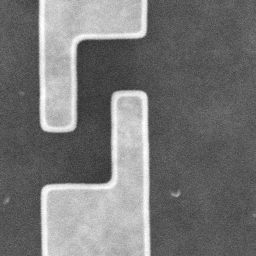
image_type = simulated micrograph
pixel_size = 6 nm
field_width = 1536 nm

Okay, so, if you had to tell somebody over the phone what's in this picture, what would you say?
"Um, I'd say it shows groups of lines, slits or small figures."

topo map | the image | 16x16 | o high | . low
...oooooo.......
...oooooo.......
...oo...........
...oo...........
...oo...........
...oo...........
...oo..oo.......
...oo..oo.......
.......oo.......
.......oo.......
.......oo.......
.......oo.......
...oooooo.......
...oooooo.......
...oooooo.......
...oooooo.......